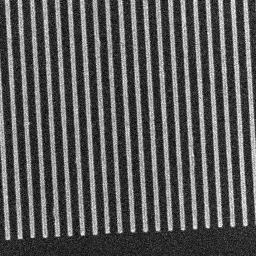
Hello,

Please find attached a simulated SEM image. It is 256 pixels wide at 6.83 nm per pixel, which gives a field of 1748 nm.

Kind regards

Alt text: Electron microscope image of parallel lines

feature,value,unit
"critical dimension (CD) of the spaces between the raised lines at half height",59.6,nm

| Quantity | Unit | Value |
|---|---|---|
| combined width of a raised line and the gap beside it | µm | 0.0855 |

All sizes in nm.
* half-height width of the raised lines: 26.4